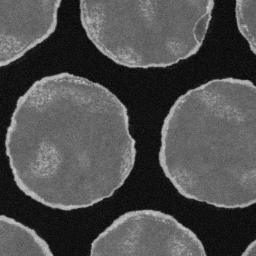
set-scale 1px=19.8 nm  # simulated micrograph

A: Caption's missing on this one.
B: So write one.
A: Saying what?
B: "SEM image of raised bodies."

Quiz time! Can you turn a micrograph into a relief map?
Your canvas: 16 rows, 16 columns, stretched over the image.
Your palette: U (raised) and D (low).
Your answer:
UUUUDUUUUUUUUDDU
UUUDDUUUUUUUDDDU
UUUDDDUUUUUUDDDU
UDDDDDDUUUUUDDDD
DDDDDDDDDDDDDDDD
DDUUUUDDDDDDUUUU
DUUUUUUUDDDUUUUU
DUUUUUUUDDUUUUUU
UUUUUUUUDDUUUUUU
DUUUUUUUDDUUUUUU
DUUUUUUUDDUUUUUU
DUUUUUUUDDDUUUUU
DDUUUUDDDDDDUUUU
DDDDDDDDUUDDDDDD
UUDDDDDUUUUUDDDD
UUUDDDUUUUUUUDDD